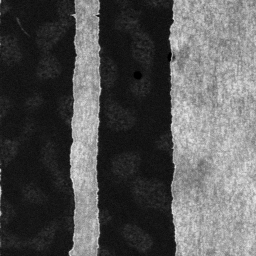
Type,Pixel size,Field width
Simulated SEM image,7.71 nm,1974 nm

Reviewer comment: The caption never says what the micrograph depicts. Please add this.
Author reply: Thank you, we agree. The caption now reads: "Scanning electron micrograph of one or a few lines or trenches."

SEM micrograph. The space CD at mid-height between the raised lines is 0.574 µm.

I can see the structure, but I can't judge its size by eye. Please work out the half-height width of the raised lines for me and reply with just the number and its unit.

187 nanometers